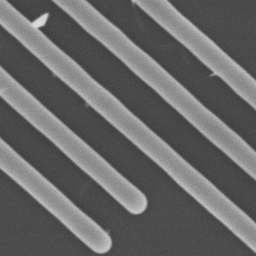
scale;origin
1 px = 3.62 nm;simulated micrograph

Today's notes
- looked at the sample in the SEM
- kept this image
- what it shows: groups of lines, slits or small figures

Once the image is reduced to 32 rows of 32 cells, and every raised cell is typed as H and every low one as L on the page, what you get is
HLLLLLLHHHHLLLLLLHHHHLLLLLLLLLLL
HHLLLLLLHHHHLLLLLLHHHHLLLLLLLLLL
HHHHHHLLLHHHHLLLLLLHHHHLLLLLLLLL
LHHHHLLLLLHHHHHLLLLLHHHHHLLLLLLL
LLHHHHLLLLLLHHHHLLLLLLHHHHLLLLLL
LLLHHHHLLLLLLHHHHLLLLLLHHHHLLLLL
LLLLHHHHLLLLLLHHHHLLLLLLHHHHLLLL
LLLLLHHHHLLLLLLHHHHLLLLLLHHHHLLL
LLLLLLHHHHLLLLLLHHHHLLLLLLHHHHLL
HLLLLLLHHHHLLLLLLHHHHLLLLLLHHHHL
HHLLLLLLHHHHLLLLLLHHHHHLLLLLHHHH
HHHHLLLLLHHHHHLLLLLLHHHHLLLLLHHH
LHHHHLLLLLLHHHHLLLLLLHHHHLLLLLLH
LLHHHHLLLLLLHHHHLLLLLLHHHHLLLLLL
LLLHHHHLLLLLLHHHHLLLLLLHHHHLLLLL
LLLLHHHHLLLLLLHHHHLLLLLLHHHHLLLL
LLLLLHHHHLLLLLLHHHHLLLLLLHHHHLLL
LLLLLLHHHHLLLLLLHHHHLLLLLLHHHHLL
HLLLLLLHHHHLLLLLLHHHHLLLLLLHHHHL
HHLLLLLLHHHHHLLLLLLHHHHLLLLLLHHH
HHHHLLLLLHHHHHLLLLLLHHHHLLLLLLHH
LHHHHLLLLLLHHHHLLLLLLHHHHLLLLLLH
LLHHHHLLLLLLHHHHLLLLLLHHHHLLLLLL
LLLHHHHLLLLLLHHHHLLLLLLHHHHLLLLL
LLLLHHHHLLLLLLHHHHLLLLLLHHHHLLLL
LLLLLHHHHLLLLLLHHHLLLLLLLHHHHLLL
LLLLLLHHHHLLLLLLHHLLLLLLLLHHHHLL
LLLLLLLHHHHHLLLLLLLLLLLLLLLHHHHH
LLLLLLLLHHHHHLLLLLLLLLLLLLLLLHHH
LLLLLLLLLLHHHHLLLLLLLLLLLLLLLLHH
LLLLLLLLLLLHHHLLLLLLLLLLLLLLLLLH
LLLLLLLLLLLLHLLLLLLLLLLLLLLLLLLL